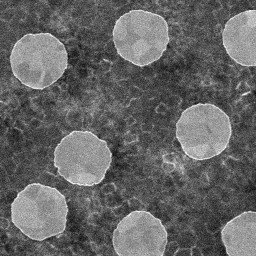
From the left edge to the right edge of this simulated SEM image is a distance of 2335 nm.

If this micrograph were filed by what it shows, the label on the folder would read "raised bodies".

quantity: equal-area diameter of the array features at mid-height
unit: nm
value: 504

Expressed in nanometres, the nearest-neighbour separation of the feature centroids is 956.